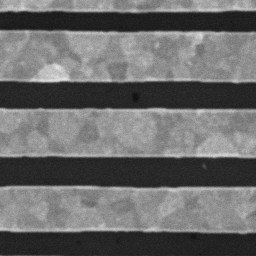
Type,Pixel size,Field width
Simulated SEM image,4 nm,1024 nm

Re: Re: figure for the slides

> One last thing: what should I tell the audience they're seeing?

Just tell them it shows lines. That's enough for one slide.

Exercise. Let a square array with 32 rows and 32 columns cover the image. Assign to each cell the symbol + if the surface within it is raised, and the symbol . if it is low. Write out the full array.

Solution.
++++++++++++++++++++++++++++++++
................................
................................
................................
++++++++++++++++++++++++++++++++
++++++++++++++++++++++++++++++++
++++++++++++++++++++++++++++++++
++++++++++++++++++++++++++++++++
++++++++++++++++++++++++++++++++
++++++++++++++++++++++++++++++++
................................
................................
................................
................................
++++++++++++++++++++++++++++++++
++++++++++++++++++++++++++++++++
++++++++++++++++++++++++++++++++
++++++++++++++++++++++++++++++++
++++++++++++++++++++++++++++++++
+++.....++++++++++++++++++++++++
................................
................................
................................
++++++++++++++++........++...+++
++++++++++++++++++++++++++++++++
++++++++++++++++++++++++++++++++
++++++++++++++++++++++++++++++++
++++++++++++++++++++++++++++++++
++++++++++++++++++++++++++++++++
................................
................................
................................